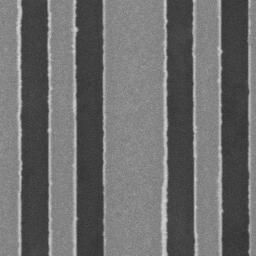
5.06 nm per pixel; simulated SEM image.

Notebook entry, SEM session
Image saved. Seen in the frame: lines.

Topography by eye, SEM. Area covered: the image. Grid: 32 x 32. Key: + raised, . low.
++....+++....++++++++...++++...+
+++...+++....++++++++...++++...+
++....+++....++++++++...++++...+
++....+++....++++++++...++++...+
++....+++....++++++++...++++...+
++....+++....++++++++...++++...+
++....+++....++++++++...++++...+
++....+++....++++++++...++++...+
++....+++....++++++++...++++...+
+++...+++....++++++++...++++...+
+++...+++....++++++++...++++...+
++....+++....++++++++...++++...+
+++...+++....++++++++...++++...+
+++...+++....++++++++...++++...+
++....+++....++++++++...++++...+
+++...+++....++++++++...++++...+
+++...+++....++++++++...++++...+
+++...+++....++++++++...++++...+
+++...+++....++++++++...++++...+
+++...+++....++++++++...++++...+
+++...+++....++++++++...++++...+
+++...+++....++++++++...++++...+
+++...+++....++++++++...++++...+
+++...+++....++++++++...++++...+
++....+++....++++++++...++++...+
++....+++....++++++++...++++...+
+++...+++....++++++++...++++...+
++....+++....++++++++...++++...+
++....+++....++++++++...++++...+
++....+++....++++++++...++++...+
+++...+++....++++++++...++++...+
++....+++....++++++++...++++...+